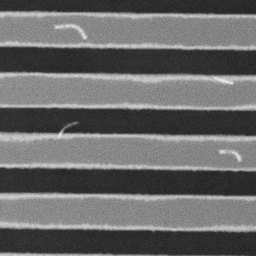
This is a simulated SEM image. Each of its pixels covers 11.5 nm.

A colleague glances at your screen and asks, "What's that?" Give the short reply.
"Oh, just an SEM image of lines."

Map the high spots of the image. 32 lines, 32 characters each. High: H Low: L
LLLLLLLLLLLLLLLLLLLLLLLLLLLLLLLL
HHHHLLLLLLLLLLLLLLLLLLLLLLLLLLLL
HHHHHHHHHHHHHHHHHHHHHHHHHHHHHHHH
HHHHHHHHHHHHHHHHHHHHHHHHHHHHHHHH
HHHHHHHHHHHHHHHHHHHHHHHHHHHHHHHH
HHHHHHHHHHHHHHHHHHHHHHHHHHHHHHHH
LLLLLLLLLLLLLLLLLLLLLLLLLLLLLLLL
LLLLLLLLLLLLLLLLLLLLLLLLLLLLLLLL
LLLLLLLLLLLLLLLLLLLLLLLLLLLLLLLL
HHHHHHHHHHHHHHHHHHHHHHHHHHHHHLLL
HHHHHHHHHHHHHHHHHHHHHHHHHHHHHHHH
HHHHHHHHHHHHHHHHHHHHHHHHHHHHHHHH
HHHHHHHHHHHHHHHHHHHHHHHHHHHHHHHH
LLLLLLLLLHHHHHHHHHHHHHHHHHHHHHHH
LLLLLLLLLLLLLLLLLLLLLLLLLLLLLLLL
LLLLLLLLLLLLLLLLLLLLLLLLLLLLLLLL
LLLLLLLLLLLLLLLLLLLLLLLLLLLLLLLL
HHHHHHHHHHHHHHHHHHHHHHHHHHHHHHHH
HHHHHHHHHHHHHHHHHHHHHHHHHHHHHHHH
HHHHHHHHHHHHHHHHHHHHHHHHHHHHHHHH
HHHHHHHHHHHHHHHHHHHHHHHHHHHHHHHH
LLLLLLLLLLLLLLLLLLLLLLLLLLLLLLLL
LLLLLLLLLLLLLLLLLLLLLLLLLLLLLLLL
LLLLLLLLLLLLLLLLLLLLLLLLLLLLLLLL
HHHHHHHHHHHHHHHHHHHHHHHHHLLLLLLL
HHHHHHHHHHHHHHHHHHHHHHHHHHHHHHHH
HHHHHHHHHHHHHHHHHHHHHHHHHHHHHHHH
HHHHHHHHHHHHHHHHHHHHHHHHHHHHHHHH
LLLLLHHHHHHHHHHHHHHHHHHHHHHHHHHH
LLLLLLLLLLLLLLLLLLLLLLLLLLLLLLLL
LLLLLLLLLLLLLLLLLLLLLLLLLLLLLLLL
LLLLLLLLLLLLLLLLLLLLLLLLLLLLLLLL